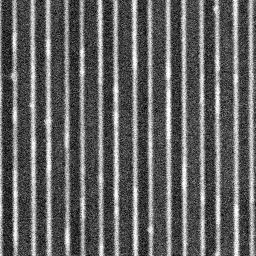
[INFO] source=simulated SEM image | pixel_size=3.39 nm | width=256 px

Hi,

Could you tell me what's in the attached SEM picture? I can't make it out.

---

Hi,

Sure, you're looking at parallel lines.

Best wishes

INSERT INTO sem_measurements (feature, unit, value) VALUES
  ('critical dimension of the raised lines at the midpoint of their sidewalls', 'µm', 0.0098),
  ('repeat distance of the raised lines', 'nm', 57.4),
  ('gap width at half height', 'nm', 45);